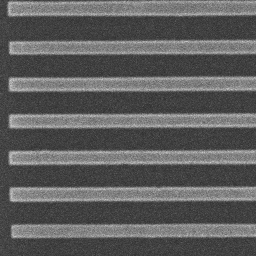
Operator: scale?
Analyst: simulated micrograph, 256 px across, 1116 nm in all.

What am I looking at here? parallel lines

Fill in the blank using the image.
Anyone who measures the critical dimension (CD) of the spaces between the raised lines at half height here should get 0.108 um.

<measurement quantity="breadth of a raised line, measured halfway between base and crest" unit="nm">52.4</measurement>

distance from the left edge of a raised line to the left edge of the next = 162 nanometers